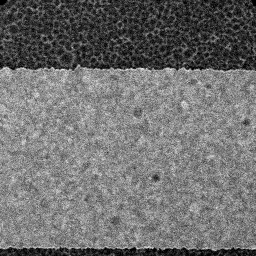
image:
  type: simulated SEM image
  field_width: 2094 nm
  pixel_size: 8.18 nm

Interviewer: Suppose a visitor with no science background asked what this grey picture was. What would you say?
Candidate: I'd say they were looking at one or a few lines or trenches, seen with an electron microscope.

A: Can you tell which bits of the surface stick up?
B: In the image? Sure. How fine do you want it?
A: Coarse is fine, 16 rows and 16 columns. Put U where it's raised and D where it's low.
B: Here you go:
DDDDDDDDDDDDDDDD
DDDDDDDDDDDDDDDD
DDDDDDDDDDDDDDDD
DDDDDDDDDDDDDDDD
UUUUUUUUUUUUUUUU
UUUUUUUUUUUUUUUU
UUUUUUUUUUUUUUUU
UUUUUUUUUUUUUUUU
UUUUUUUUUUUUUUUU
UUUUUUUUUUUUUUUU
UUUUUUUUUUUUUUUU
UUUUUUUUUUUUUUUU
UUUUUUUUUUUUUUUU
UUUUUUUUUUUUUUUU
UUUUUUUUUUUUUUUU
DDDDDDDUDDUUUUUU